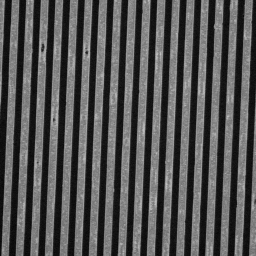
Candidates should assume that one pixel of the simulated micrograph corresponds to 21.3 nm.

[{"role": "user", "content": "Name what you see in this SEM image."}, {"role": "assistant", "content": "parallel lines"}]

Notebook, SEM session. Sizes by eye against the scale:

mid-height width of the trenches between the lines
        152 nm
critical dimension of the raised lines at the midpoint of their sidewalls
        152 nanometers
